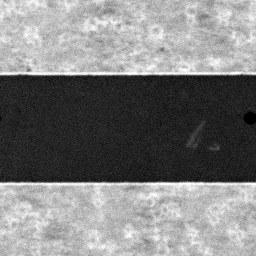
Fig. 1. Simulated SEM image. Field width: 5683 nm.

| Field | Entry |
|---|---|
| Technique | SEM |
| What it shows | one or a few lines or trenches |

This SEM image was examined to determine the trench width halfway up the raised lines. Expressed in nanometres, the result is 2460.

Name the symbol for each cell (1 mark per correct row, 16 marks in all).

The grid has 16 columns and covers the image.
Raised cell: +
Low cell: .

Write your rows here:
++++++++++++++++
++++++++++++++++
++++++++++++++++
++++++++++++++++
++++++++++++++++
................
................
................
................
................
................
................
++++++++++++++++
++++++++++++++++
++++++++++++++++
++++++++++++++++